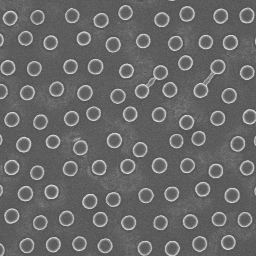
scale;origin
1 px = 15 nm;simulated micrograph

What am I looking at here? a regular array of raised bodies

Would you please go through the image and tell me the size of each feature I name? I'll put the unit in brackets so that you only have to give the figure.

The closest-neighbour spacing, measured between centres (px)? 25.1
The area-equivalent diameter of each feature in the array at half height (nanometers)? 213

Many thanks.